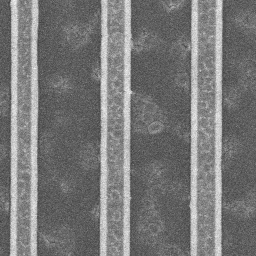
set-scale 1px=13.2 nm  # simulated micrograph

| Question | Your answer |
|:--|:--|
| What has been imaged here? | one or a few lines or trenches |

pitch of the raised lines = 1200 nanometres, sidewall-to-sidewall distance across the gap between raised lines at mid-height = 909 nanometers